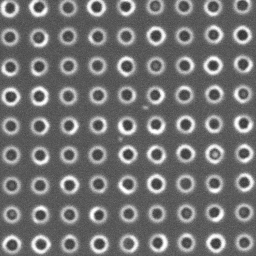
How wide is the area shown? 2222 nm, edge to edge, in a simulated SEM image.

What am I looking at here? a regular array of holes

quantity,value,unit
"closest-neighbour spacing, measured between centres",248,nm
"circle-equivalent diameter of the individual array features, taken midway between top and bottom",12.3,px